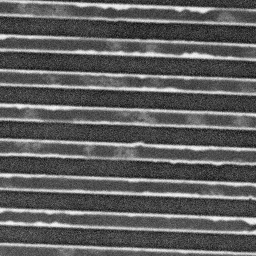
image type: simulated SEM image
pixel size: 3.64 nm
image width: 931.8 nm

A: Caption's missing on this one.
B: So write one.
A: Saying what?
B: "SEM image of parallel lines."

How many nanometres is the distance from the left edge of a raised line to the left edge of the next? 126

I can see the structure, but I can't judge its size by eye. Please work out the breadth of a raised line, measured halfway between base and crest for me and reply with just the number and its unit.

0.0596 um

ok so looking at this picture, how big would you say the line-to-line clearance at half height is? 67.3 nanometers